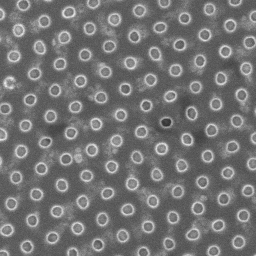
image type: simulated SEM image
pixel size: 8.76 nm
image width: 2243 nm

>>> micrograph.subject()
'a regular array of holes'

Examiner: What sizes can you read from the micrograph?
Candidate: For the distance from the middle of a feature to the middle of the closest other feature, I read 229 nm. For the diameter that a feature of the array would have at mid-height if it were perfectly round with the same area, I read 86.2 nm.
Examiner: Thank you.